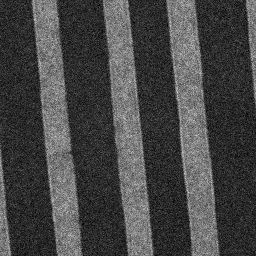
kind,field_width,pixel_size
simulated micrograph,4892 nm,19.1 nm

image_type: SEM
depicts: one or a few lines or trenches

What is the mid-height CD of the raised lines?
0.466 microns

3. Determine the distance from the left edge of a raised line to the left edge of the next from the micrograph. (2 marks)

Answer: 67.9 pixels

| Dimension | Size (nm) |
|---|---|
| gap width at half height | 877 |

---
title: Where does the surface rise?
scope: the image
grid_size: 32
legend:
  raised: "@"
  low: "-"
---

----@@@------@@@-----@@@-------@
----@@@------@@@-----@@@-------@
----@@@------@@@-----@@@-------@
----@@@------@@@-----@@@@------@
-----@@------@@@-----@@@@------@
-----@@@------@@-----@@@@------@
-----@@@------@@@-----@@@------@
-----@@@------@@@-----@@@------@
-----@@@------@@@-----@@@-------
-----@@@------@@@-----@@@-------
-----@@@------@@@-----@@@-------
-----@@@------@@@-----@@@-------
-----@@@------@@@-----@@@-------
-----@@@------@@@-----@@@@------
-----@@@------@@@-----@@@@------
-----@@@@-----@@@------@@@------
------@@@-----@@@@-----@@@------
------@@@------@@@-----@@@------
------@@@------@@@-----@@@------
------@@@------@@@-----@@@------
------@@@------@@@-----@@@------
------@@@------@@@-----@@@------
------@@@------@@@-----@@@------
------@@@------@@@-----@@@@-----
-------@@@-----@@@-----@@@@-----
@------@@@-----@@@------@@@-----
@------@@@------@@@-----@@@-----
@------@@@------@@@-----@@@-----
@------@@@------@@@-----@@@-----
@------@@@------@@@-----@@@-----
@------@@@------@@@-----@@@-----
@------@@@------@@@-----@@@-----